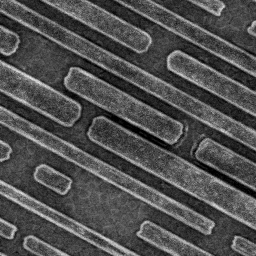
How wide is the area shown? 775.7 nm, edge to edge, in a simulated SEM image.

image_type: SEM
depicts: parallel lines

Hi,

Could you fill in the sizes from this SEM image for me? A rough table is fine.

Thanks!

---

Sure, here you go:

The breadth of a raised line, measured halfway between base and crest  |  50.6 nanometers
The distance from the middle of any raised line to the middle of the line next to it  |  99.3 nm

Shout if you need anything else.